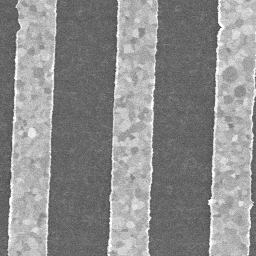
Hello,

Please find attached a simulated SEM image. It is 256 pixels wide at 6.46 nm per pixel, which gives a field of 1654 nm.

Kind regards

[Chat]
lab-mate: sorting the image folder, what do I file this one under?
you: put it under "one or a few lines or trenches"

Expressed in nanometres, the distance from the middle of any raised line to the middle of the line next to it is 650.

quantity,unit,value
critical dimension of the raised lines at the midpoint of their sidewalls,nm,251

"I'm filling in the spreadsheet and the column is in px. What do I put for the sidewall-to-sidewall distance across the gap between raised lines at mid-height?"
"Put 61.7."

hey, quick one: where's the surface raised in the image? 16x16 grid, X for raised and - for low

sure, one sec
-XXX---XXX----XX
-XX----XXX----XX
-XX----XXX----XX
-XX----XXX----XX
-XX----XXX---XXX
-XX----XXX---XXX
-XX----XXX---XXX
-XX----XXX---XXX
-XX----XXX---XXX
-XX----XXX---XXX
-XX----XXX---XXX
-XX----XX----XXX
-XX----XX----XXX
-XX----XX----XXX
-XX----XX----XXX
-XX----XX----XXX